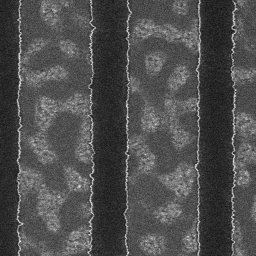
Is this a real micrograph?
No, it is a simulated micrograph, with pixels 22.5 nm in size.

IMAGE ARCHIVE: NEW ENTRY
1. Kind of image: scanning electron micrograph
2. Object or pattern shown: one or a few lines or trenches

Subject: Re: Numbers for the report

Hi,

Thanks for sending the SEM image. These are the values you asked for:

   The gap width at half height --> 1590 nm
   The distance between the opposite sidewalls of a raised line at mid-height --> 0.798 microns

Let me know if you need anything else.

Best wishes